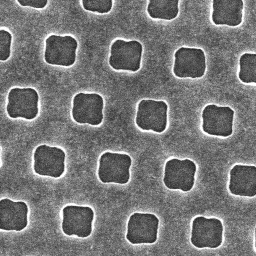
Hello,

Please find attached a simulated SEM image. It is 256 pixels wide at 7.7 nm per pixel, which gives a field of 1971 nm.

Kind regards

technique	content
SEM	a regular array of holes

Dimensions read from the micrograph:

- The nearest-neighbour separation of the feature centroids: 0.495 µm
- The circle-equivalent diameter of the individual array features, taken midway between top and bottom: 259 nm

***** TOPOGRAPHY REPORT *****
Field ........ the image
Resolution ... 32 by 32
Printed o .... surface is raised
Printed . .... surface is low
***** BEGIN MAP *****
ooo...oooo....oooo....ooooo...oo
oooooooooooo.ooooo....oooo....oo
ooooooooooooooooooooooooooo...oo
oooooooooooooooooooooooooooooooo
.ooooo...ooooooooooooooooooooooo
.ooooo....oooo....oooooooooooooo
.ooooo....oooo....oooo...ooooooo
.ooooo...ooooo....oooo....oooo..
oooooooooooooo...ooooo....oooo..
oooooooooooooooooooooo...ooooo..
oooooooooooooooooooooooooooooooo
o....ooooooooooooooooooooooooooo
o....oooo....ooooo.ooooooooooooo
o....oooo....oooo....ooooo...ooo
o....oooo....oooo....oooo....ooo
ooooooooooo.ooooo....oooo....ooo
ooooooooooooooooooo.oooooo...ooo
oooooooooooooooooooooooooooooooo
ooooo...oooooooooooooooooooooooo
oooo....ooooo...oooooooooooooooo
oooo....oooo....ooooo...oooooooo
oooo....oooo....ooooo...ooooo...
ooooooooooooo...oooo....ooooo...
ooooooooooooooooooooo...ooooo...
oooooooooooooooooooooooooooooo..
...ooooooooooooooooooooooooooooo
...ooooo....oooooooooooooooooooo
...ooooo....oooo....oooo...ooooo
...ooooo...ooooo....oooo....oooo
ooooooooo..ooooo....oooo....oooo
oooooooooooooooooooooooo....oooo
oooooooooooooooooooooooooooooooo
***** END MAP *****